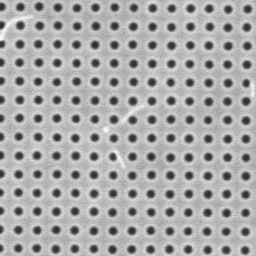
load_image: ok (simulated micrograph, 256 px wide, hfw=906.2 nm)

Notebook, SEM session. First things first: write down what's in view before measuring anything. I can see a regular array of holes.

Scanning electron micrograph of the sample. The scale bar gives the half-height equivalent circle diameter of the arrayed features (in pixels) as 8.95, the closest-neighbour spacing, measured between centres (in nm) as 64.2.